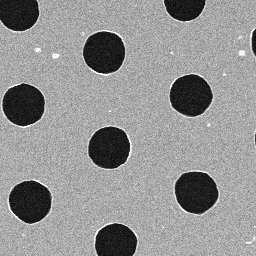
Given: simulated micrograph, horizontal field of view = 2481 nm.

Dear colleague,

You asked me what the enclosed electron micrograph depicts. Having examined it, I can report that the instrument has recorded holes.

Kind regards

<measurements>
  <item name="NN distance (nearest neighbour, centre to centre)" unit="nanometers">927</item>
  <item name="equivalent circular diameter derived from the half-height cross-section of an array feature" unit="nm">412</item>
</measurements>